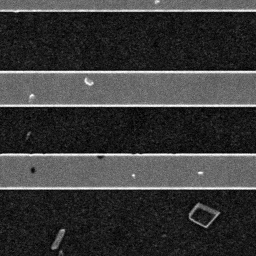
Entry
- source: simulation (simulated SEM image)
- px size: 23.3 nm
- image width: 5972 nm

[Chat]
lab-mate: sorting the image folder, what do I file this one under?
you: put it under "lines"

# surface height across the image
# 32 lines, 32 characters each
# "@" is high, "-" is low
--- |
@@@@@@@@@@@@@@@@@@@@@@@@@@@@@@@@
--------------------------------
--------------------------------
--------------------------------
--------------------------------
--------------------------------
--------------------------------
--------------------------------
--------------------------------
@@@@@@@@@@@@@@@@@@@@@@@@@@@@@@@@
@@@@@@@@@@@@@@@@@@@@@@@@@@@@@@@@
@@@@@@@@@@@@@@@@@@@@@@@@@@@@@@@@
@@@@@@@@@@@@@@@@@@@@@@@@@@@@@@@@
--------------------------------
--------------------------------
--------------------------------
--------------------------------
--------------------------------
--------------------------------
@@@@@@@@@@@@@@@@@@@@@@@@@@@@@@@@
@@@@@@@@@@@@@@@@@@@@@@@@@@@@@@@@
@@@@@@@@@@@@@@@@@@@@@@@@@@@@@@@@
@@@@@@@@@@@@@@@@@@@@@@@@@@@@@@@@
@@@@@@@@@@@@@@@@@@@@@@@@@@@@@@@@
--------------------------------
--------------------------------
--------------------------------
--------------------------------
--------------------------------
--------------------------------
--------------------------------
--------------------------------